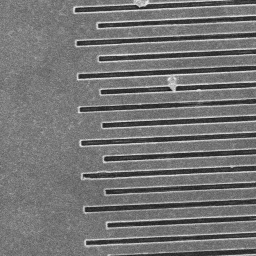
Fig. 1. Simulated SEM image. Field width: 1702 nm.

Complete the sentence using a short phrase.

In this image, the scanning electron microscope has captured parallel lines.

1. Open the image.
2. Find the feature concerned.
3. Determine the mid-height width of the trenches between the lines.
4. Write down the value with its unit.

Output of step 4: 0.0357 microns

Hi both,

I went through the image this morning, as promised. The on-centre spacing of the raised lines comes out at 111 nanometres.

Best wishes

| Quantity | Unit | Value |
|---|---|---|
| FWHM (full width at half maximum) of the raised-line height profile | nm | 71.4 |